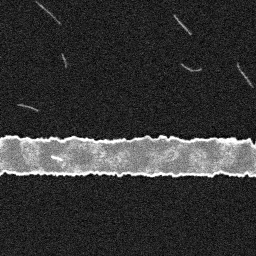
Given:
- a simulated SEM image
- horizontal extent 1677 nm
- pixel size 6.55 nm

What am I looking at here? one or a few lines or trenches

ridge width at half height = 224 nanometers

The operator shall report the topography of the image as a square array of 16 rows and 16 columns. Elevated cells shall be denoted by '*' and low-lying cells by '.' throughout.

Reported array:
................
................
................
................
................
................
................
................
................
****************
****************
................
................
................
................
................